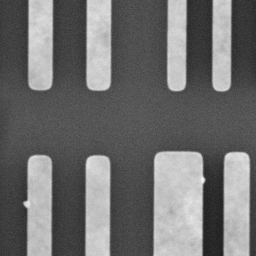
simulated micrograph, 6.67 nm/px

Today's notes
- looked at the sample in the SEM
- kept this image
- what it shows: groups of lines, slits or small figures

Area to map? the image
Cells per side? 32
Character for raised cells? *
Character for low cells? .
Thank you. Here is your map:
....**.....***.......**....**...
....**.....***.......**....**...
....**.....***.......**....**...
....**.....***.......**....**...
....**.....***.......**....**...
....**.....***.......**....**...
....**.....***.......**....**...
....**.....***.......**....**...
....**.....***.......**....**...
....**.....***.......**....**...
....**.....***.......**....**...
................................
................................
................................
................................
................................
................................
................................
................................
....................*****...***.
....**.....***.....******...***.
....**.....***.....******...***.
....**.....***.....******...***.
....**.....***.....******...***.
....**.....***.....******...***.
...***.....***.....******...***.
....**.....***.....******...***.
....**.....***.....******...***.
....**.....***.....******...***.
...***.....***.....******...***.
...***.....***.....******...***.
...***.....***.....******...***.